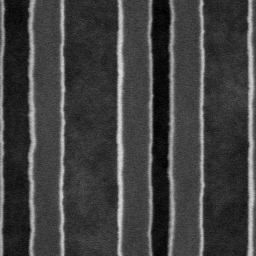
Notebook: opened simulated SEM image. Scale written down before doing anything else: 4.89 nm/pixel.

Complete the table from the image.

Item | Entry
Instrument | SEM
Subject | lines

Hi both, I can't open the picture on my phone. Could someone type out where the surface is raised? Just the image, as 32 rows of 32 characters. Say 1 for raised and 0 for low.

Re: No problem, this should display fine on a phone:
00001111000000011110011110000001
00001111000000011110011110000001
00001111000000011110011110000001
10001111000000011110011110000001
10001111000000011110011110000001
00001111000000011110011110000001
00001111000000011110011110000001
00001111000000011110011110000001
00001111000000011110011110000001
00001111000000011110011110000001
00001111000000011110011110000001
00001111000000011110011110000001
00001111000000011110011110000001
00001111000000011110011110000001
00001111000000011110011110000001
00001111000000011110011110000001
00001111000000011110011110000001
00001111000000011110011110000001
00001111000000011110011110000001
00001111000000011110011110000001
00001111000000011110011110000001
00001111000000011110011110000001
00001111000000011110011110000001
00001111000000011110011110000001
00001111000000011110011110000001
00001111000000011110011110000001
00001111000000011110011110000001
00001111000000011110011110000001
00001111000000011110011110000001
00001111000000011110011110000001
00001111000000011110011110000001
00001111000000011110011110000001